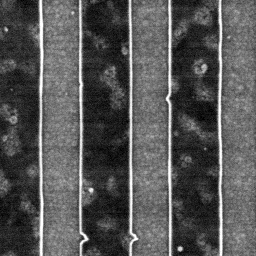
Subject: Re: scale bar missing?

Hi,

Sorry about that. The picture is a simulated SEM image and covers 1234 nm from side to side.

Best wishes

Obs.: one or a few lines or trenches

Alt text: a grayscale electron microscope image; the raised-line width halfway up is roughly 248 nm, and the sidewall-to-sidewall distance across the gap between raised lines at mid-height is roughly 184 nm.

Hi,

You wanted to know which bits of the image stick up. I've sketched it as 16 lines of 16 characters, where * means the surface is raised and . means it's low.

***..***...***..
***..***...***..
***..***...***..
***..***...***..
***..***...***..
***..***...***..
***..***...***..
***..***...***..
***..***...***..
***..***...***..
***..***...***..
***..***...***..
***..***...***..
***..***...***..
***..***...***..
***..***...***..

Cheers